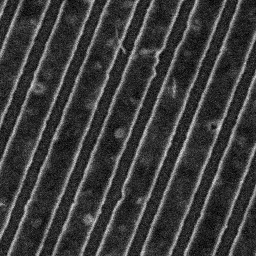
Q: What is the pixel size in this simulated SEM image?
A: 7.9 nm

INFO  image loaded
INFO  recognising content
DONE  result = parallel lines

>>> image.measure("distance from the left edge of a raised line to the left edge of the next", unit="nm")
324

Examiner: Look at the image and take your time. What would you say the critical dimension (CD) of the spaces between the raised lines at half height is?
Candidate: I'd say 0.1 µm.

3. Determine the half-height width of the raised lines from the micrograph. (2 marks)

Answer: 0.223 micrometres